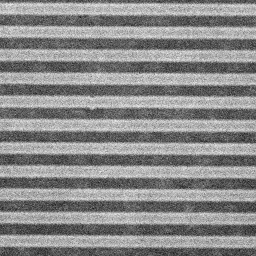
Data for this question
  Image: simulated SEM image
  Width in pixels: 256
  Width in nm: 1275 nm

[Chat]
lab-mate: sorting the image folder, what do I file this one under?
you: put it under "parallel lines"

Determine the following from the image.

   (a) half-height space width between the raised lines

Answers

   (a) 0.0629 µm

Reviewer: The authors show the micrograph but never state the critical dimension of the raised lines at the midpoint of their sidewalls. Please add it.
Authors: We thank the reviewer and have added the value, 54.2 nm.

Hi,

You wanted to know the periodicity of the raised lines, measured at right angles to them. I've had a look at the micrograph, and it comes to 116 nanometers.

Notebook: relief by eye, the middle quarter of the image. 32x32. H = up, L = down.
LLLLLLLLLLLLLLLLLLLLLLLLLLLLLLLL
LLLLLLLLLLLLLLLLLLLLLLLLLLLLLLLL
HHHHHHHHHHHHHHHHHHHHHHHHLLLLLLLL
HHHHHHHHHHHHHHHHHHHHHHHHHHHHHHHH
HHHHHHHHHHHHHHHHHHHHHHHHHHHHHHHH
LLLLLLLLLLLLLLLLLLLLLLLLLLLLLLLL
LLLLLLLLLLLLLLLLLLLLLLLLLLLLLLLL
LLLLLLLLLLLLLLLLLLLLLLLLLLLLLLLL
HHHHHHHHHHHHHHHHHHHHHHHHHHHHHHHH
HHHHHHHHHHHHHHHHHHHHHHHHHHHHHHHH
HHHHHHHHHHHHHHHHHHHHHHHHHHHHHHHH
LLLLLLLLLLLLLLLLLLLLLLLLLLLLLLLL
LLLLLLLLLLLLLLLLLLLLLLLLLLLLLLLL
LLLLLLLLLLLLLLLLLLLLLLLLLLLLLLLL
HHHHHHHHHHHHHHHHHHHHHHHHHHHHHHHH
HHHHHHHHHHHHHHHHHHHHHHHHHHHHHHHH
LLLLLLLLLHHHHHHHHHHHHHHHHHHHHHHH
LLLLLLLLLLLLLLLLLLLLLLLLLLLLLLLL
LLLLLLLLLLLLLLLLLLLLLLLLLLLLLLLL
LLLLLLLLLLLLLLLLLLLLLLLLLLLLLLLL
HHHHHHHHHHHHHHHHHHHHHHHHHHHHHHHH
HHHHHHHHHHHHHHHHHHHHHHHHHHHHHHHH
LLLLLLLLLLLLLLLLLLLLLLLLLLLLLLLH
LLLLLLLLLLLLLLLLLLLLLLLLLLLLLLLL
LLLLLLLLLLLLLLLLLLLLLLLLLLLLLLLL
LLLLLLLLLLLLLLLLLLLLLLLLLLLLLLLL
HHHHHHHHHHHHHHHHHHHHHHHHHHHHHHHH
HHHHHHHHHHHHHHHHHHHHHHHHHHHHHHHH
LLLLLLLLLLLLLLLLLLLLLLLLLLLLLLLL
LLLLLLLLLLLLLLLLLLLLLLLLLLLLLLLL
LLLLLLLLLLLLLLLLLLLLLLLLLLLLLLLL
HHHHHHHHHHHHHLLLLLLLLLLLLLLLLLLL